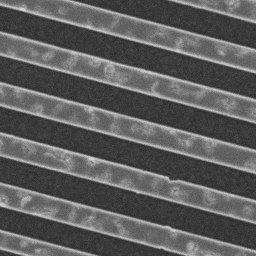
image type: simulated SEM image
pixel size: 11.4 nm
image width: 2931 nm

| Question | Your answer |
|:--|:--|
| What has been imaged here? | parallel lines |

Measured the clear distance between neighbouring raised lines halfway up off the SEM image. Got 300 nm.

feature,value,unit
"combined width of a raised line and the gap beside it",555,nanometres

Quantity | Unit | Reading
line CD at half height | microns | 0.252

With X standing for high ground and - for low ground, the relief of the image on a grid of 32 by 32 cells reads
XXXXXXXXXXX------------XXXXXXXXX
---XXXXXXXXXXX-------------XXXXX
-------XXXXXXXXXXX-------------X
-----------XXXXXXXXXXX----------
XX-------------XXXXXXXXXXX------
XXXXX--------------XXXXXXXXXX---
XXXXXXXXX-------------XXXXXXXXXX
--XXXXXXXXXXX-------------XXXXXX
------XXXXXXXXXXX-------------XX
----------XXXXXXXXXXX-----------
--------------XXXXXXXXXX--------
XXXX-------------XXXXXXXXXXX----
XXXXXXXX-------------XXXXXXXXXXX
-XXXXXXXXXXX-------------XXXXXXX
-----XXXXXXXXXX--------------XXX
---------XXXXXXXXXX-------------
------------XXXXXXXXXXX---------
XXX-------------XXXXXXXXXXX-----
XXXXXXX-------------XXXXXXXXXXX-
XXXXXXXXXXX-------------XXXXXXXX
----XXXXXXXXXXX------------XXXXX
--------XXXXXXXXXX-------------X
------------XXXXXXXXX-----------
XX-------------XXXXXXXXXXX------
XXXXXX-------------XXXXXXXXXXX--
XXXXXXXXXX-------------XXXXXXXXX
---XXXXXXXXXXX-------------XXXXX
-------XXXXXXXXXXX------------XX
----------XXXXXXXXXXX-----------
XXX-----------XXXXXXXXXXX-------
XXXXXX------------XXXXXXXXXXX---
-XXXXXXXXX------------XXXXXXXXXX